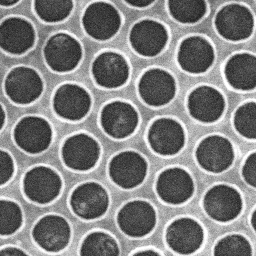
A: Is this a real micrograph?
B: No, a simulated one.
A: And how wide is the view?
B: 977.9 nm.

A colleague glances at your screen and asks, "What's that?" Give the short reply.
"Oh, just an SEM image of a regular array of holes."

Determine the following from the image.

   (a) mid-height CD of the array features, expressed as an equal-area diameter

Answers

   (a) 152 nanometres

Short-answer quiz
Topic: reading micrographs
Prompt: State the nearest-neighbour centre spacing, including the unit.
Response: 0.191 um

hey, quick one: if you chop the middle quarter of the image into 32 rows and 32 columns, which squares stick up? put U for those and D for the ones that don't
DDDUUUUDDDDDDDDDUUUUUUUUUUUUUDDD
DDUUUUUDDDDDDDDDDUUUUDDDDUUUUUDD
UUUUUUUDDDDDDDDDUUUUDDDDDDDUUUUU
UUUUUUUDDDDDDDDDUUUDDDDDDDDDUUUU
UUUUUUUUDDDDDDDDUUDDDDDDDDDDUUUU
DDDDDUUUDDDDDDDUUUDDDDDDDDDDUUUU
DDDDDDUUUUUUUUUUUUDDDDDDDDDDUUUU
DDDDDDDUUUUUUUUUUUUDDDDDDDDDUUUD
DDDDDDDUUUUUUUUUUUUDDDDDDDDDUUUD
DDDDDDDUUUUUDDDDUUUUDDDDDDDUUUUD
DDDDDDDUUUDDDDDDDUUUUDDDDUUUUUUD
DDDDDDDUUDDDDDDDDDUUUUUUUUUUUUUD
DDDDDDUUUDDDDDDDDDDUUUUUUUUUUUUD
DDDDDUUUUDDDDDDDDDDUUUUUDDDUUUUU
UUDUUUUUUDDDDDDDDDDUUUDDDDDDDUUU
UUUUUUUUUDDDDDDDDDDUUDDDDDDDDDUU
UUUUUUUUUUDDDDDDDDUUUDDDDDDDDDUU
UUUDDDUUUUUDDDDDDUUUUDDDDDDDDDUU
UDDDDDDDUUUUDDDDUUUUUDDDDDDDDDDU
DDDDDDDDDUUUUUUUUUUUUDDDDDDDDDUU
DDDDDDDDDUUUUUUUUUUUUDDDDDDDDDUU
DDDDDDDDDUUUUUUDDUUUUUDDDDDDDUUU
DDDDDDDDDUUUUDDDDDDUUUUDDDDDUUUU
DDDDDDDDDUUUDDDDDDDDUUUUUUUUUUUU
DDDDDDDDDUUDDDDDDDDDDUUUUUUUUUUU
DDDDDDDDUUUDDDDDDDDDDUUUUUUUUUUU
UUDDDDDUUUUDDDDDDDDDDUUUUDDDDDDU
UUUUUUUUUUUDDDDDDDDDDUUUDDDDDDDD
UUUUUUUUUUUDDDDDDDDDDUUDDDDDDDDD
UUUUUDDDUUUUDDDDDDDDUUUDDDDDDDDD
UUUDDDDDDDUUUDDDDDDUUUUDDDDDDDDD
UUDDDDDDDDDUUUUUUUUUUUUDDDDDDDDD